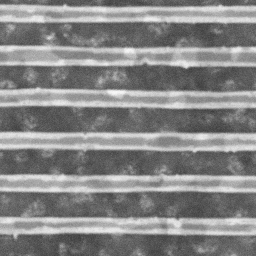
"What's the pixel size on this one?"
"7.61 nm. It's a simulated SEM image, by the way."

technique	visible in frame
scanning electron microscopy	parallel lines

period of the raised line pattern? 0.322 µm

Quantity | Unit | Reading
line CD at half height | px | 13.7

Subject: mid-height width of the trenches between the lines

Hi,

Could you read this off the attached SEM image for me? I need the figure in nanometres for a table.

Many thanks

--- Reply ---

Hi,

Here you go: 216